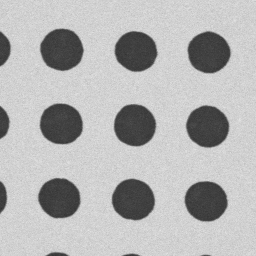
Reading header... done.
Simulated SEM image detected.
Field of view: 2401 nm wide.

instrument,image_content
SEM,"a regular array of holes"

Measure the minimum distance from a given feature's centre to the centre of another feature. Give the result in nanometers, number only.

684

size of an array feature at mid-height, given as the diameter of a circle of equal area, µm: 0.395